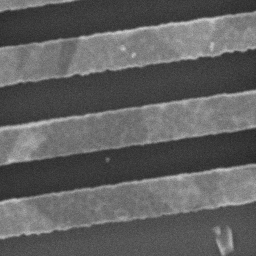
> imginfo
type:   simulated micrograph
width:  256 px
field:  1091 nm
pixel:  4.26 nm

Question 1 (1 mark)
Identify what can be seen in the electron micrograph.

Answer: lines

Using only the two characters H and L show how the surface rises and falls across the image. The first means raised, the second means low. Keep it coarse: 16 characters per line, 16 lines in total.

HLLLLLLLLLLLLLLL
LLLLLLLLLLLHHHHH
LLLHHHHHHHHHHHHH
HHHHHHHHHHHHHLLL
HHHHHHLLLLLLLLLL
LLLLLLLLLLLLLLLL
LLLLLLLLLLHHHHHH
LLLHHHHHHHHHHHHH
HHHHHHHHHHHHLLLL
HHHHHHLLLLLLLLLL
LLLLLLLLLLLLLLHH
LLLLLLLHHHHHHHHH
HHHHHHHHHHHHHHHH
HHHHHHHHHHLLLLLL
HHHLLLLLLLLLLLLL
LLLLLLLLLLLLLLLL